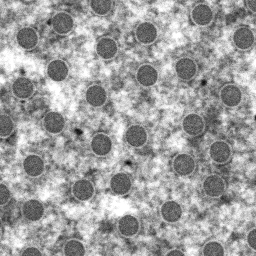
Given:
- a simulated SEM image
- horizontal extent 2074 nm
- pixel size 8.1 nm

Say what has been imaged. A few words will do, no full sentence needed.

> a regular array of raised bodies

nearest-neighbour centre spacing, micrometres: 0.318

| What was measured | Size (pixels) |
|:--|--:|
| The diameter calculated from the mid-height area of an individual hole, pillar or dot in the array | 23.1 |